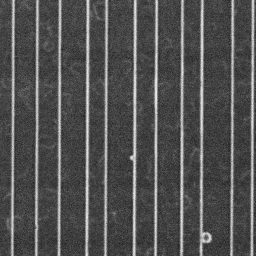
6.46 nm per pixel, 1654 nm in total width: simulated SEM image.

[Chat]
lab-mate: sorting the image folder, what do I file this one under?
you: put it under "parallel lines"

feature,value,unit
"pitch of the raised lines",48.6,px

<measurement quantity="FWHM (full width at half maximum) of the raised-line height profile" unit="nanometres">132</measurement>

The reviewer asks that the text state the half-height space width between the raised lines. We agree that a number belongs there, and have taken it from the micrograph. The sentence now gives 0.178 microns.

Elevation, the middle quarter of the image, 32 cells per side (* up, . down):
......*****.......*****.......**
......****........*****.......**
......****........*****.......**
......****........*****.......**
......****........*****.......**
......****........*****.......**
......****........*****.......**
......****........*****.......**
......****........*****.......**
......****........*****.......**
......****........*****.......**
......****........*****.......**
......****........*****.......**
......****........*****.......**
......****........*****.......**
......****........*****.......**
......****........*****.......**
......****........*****.......**
......****........*****.......**
......****........*****.......**
......****........*****.......**
......****........*****.......**
......****........*****.......**
......****........*****.......**
......****........*****.......**
......****........*****.......**
......****........*****.......**
......****........*****.......**
......****........*****.......**
......****........*****.......**
......****........*****.......**
......****........*****.......**